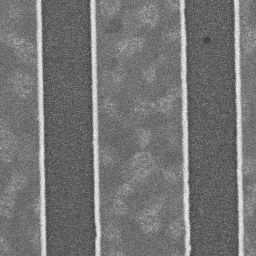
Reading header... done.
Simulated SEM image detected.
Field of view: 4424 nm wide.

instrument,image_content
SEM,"one or a few lines or trenches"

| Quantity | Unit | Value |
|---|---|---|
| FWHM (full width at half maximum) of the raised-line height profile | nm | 1560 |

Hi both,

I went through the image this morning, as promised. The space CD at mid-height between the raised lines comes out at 927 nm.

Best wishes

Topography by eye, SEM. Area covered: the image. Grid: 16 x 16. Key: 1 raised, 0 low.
1100001111100001
1100001111100001
1100001111100001
1100001111100001
1100001111110001
1110001111110001
1110001111110001
1110001111110001
1110001111110001
1110001111110001
1110001111110001
1110001111110001
1110001111110001
1110001111110001
1110001111110001
1110001111110001